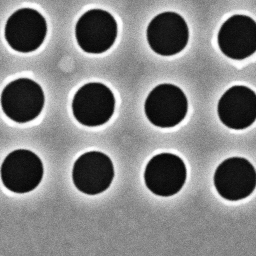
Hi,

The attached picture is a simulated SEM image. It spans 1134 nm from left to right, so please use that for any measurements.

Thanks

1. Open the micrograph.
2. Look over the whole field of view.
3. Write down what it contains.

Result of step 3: holes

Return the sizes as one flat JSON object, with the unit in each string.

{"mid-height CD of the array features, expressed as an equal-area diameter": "194 nanometres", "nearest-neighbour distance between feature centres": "304 nm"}